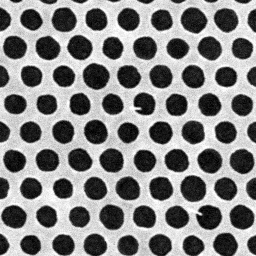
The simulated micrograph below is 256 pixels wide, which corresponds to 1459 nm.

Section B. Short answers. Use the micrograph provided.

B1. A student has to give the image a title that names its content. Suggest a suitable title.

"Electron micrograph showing a regular array of holes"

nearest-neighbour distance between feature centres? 0.182 microns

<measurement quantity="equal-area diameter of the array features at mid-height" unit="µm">0.136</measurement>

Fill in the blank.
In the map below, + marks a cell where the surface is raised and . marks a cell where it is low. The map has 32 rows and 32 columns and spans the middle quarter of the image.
.+++++....++++....+++++...+++++.
..+++......++......+++.....+++..
...++......++......++......++...
...++......++......++......++...
...++......+++.....+++.....+++..
..++++....++++....++++....+++++.
+++++++..+++++++++++++++++++++++
+++..++++++..++++++...+++++..+++
++....++++....++++....++++.....+
+.....+++......++......++......+
+......++......++......++......+
++....++++.....+++.....+++.....+
+++...+++++..++++++...++++....++
++++++++++++++++++++++++++++++++
..++++....+++++..++++++...+++++.
..+++......+++....++++.....+++..
...++......++......++......++...
...++......++......++......++...
..+++......+++....+++......+++..
..++++....+++++..+++++....+++++.
++++++++++++++++++++++++++++++++
++...+++++....+++++..++++++...++
+.....+++......+++....+++......+
+......++......++......++......+
+......++......++......++......+
++.....++......+++.....++......+
+++...++++....++++....++++.....+
++++++++++++++++++++++++++++++++
++++++...+++++....+++++...++++..
..+++.....+++.....+++......++...
..+++......++......++......++...
..+++......++......++......++...